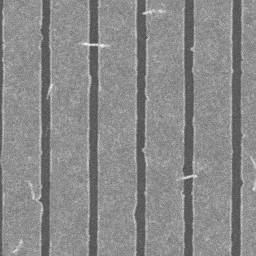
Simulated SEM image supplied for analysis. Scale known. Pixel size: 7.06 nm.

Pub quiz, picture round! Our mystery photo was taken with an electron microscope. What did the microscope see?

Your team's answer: parallel lines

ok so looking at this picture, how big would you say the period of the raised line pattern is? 336 nm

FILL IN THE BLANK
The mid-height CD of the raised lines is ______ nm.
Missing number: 272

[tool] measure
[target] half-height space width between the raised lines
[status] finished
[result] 0.0662 um